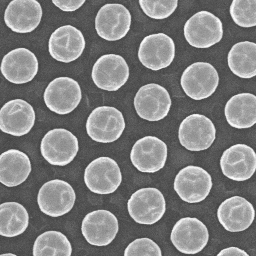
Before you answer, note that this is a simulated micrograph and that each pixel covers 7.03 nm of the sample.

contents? a regular array of raised bodies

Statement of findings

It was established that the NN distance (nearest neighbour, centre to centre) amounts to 359 nanometers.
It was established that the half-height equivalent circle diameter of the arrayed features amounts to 254 nm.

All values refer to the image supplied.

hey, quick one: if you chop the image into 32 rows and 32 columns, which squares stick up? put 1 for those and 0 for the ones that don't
01111001110000000011110000000111
01111000000011110011100001000111
01111000000011110000000011100111
01110001100011110000000111110000
00000011110001100001100111110000
00000011111000000011110011100011
01110011110000000111110000000111
11111001100011100011110000000111
11111000000011110001000111100111
01110000000011110000000111100011
00000011110011100000000111100000
00000011110000000111100111100000
00000011110000000111100000000111
11110011100011000111100000001111
11110000000111100011100010001111
11110000000111110000000111100111
01100011100111100000001111100000
00000111110011000011000111100000
00000111110000000111100111000110
11100111100000001111100000001111
11110001000111100111000000001111
11110000000111100010000111001111
11100000000111100000001111000000
00000111100111100000001111000000
00000111100000000111000111000000
01000111100000001111100000001110
11100111000011001111000000011111
11100000000111100111000110011111
11100000001111100000001111001110
00000111000111000000011111000000
00001111100010001110001111000000
00001111100000001111000110001110